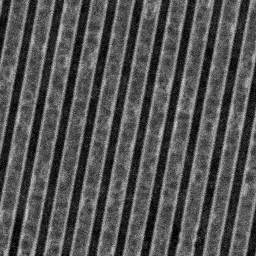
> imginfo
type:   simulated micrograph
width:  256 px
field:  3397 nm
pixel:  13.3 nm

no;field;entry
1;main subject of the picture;parallel lines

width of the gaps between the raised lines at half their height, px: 10.8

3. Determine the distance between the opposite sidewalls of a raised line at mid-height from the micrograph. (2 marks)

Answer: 199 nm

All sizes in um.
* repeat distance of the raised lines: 0.344